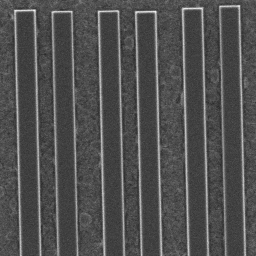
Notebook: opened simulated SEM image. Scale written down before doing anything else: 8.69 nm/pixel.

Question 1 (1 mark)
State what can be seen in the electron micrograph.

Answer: parallel lines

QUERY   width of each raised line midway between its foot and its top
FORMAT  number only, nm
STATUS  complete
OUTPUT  178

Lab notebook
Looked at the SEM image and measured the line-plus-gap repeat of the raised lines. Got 354 nanometers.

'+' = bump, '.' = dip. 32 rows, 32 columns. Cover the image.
................................
..++...++....++..++....++...++..
..++...++...+++..++....++...++..
..++...++...+++..+++...++...++..
..++...++...+++..+++...++...++..
..++...++...+++..+++...++...++..
..++...++...+++..+++...++...++..
..+++..++...+++..+++...+++..++..
..+++..++...+++..+++...+++..++..
..+++..++...+++..+++...++...++..
..+++..++....++..+++...++...++..
..+++..++....++..+++...++...++..
..+++..++....++..+++...+++..++..
..+++..++....++..+++...+++..++..
..+++..++....++..+++...+++..++..
..+++..++....++..+++...+++..++..
..+++..++....++..+++...+++..++..
..+++..++....++..+++...+++..++..
..+++..++....++..+++...+++..++..
..+++..++....++..+++...+++..++..
..+++..++....++..+++...+++..++..
..+++..++....++..+++...+++..++..
..+++..++....++...++...+++..++..
..+++..+++...++...++...+++..++..
..+++..+++...++...++...+++..++..
..+++..+++...++...++...+++..++..
...++..+++...++...++...+++..++..
...++..+++...++...++....++..+++.
...++..+++...++...++....++..+++.
...++..+++...++...++....++..+++.
...++..+++...++...++....++..+++.
...++..+++...++...++....++..+++.